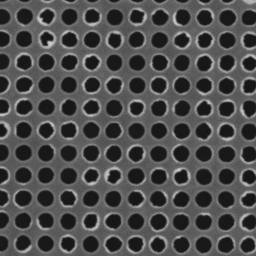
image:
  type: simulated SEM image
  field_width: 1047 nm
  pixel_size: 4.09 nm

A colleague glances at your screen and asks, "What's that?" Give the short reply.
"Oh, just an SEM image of a regular array of holes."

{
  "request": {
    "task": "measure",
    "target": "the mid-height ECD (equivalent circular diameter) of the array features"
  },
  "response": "64.7 nanometers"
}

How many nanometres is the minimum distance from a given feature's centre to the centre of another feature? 90.9